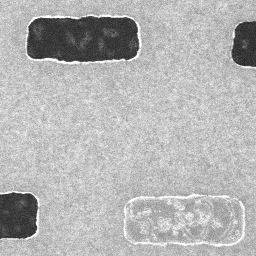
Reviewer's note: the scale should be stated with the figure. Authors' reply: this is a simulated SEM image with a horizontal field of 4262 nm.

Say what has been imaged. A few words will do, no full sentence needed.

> holes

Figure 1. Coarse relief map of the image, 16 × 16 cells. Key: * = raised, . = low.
****************
**......*******.
**.......******.
**......*******.
****************
****************
****************
****************
****************
****************
****************
****************
..******.......*
..******.......*
..******.......*
****************